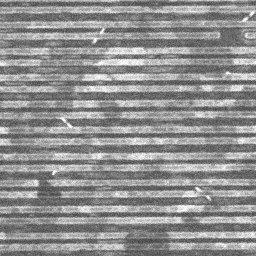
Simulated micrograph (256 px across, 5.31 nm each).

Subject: parallel lines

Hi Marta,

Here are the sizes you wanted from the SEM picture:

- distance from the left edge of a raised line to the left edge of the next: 70.1 nm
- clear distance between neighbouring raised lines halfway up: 35.9 nanometers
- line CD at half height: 4.88 px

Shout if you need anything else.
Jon